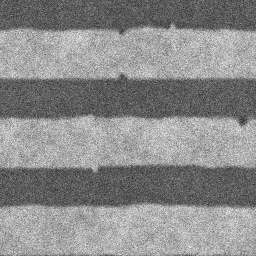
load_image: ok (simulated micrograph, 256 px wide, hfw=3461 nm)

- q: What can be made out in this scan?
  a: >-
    one or a few lines or trenches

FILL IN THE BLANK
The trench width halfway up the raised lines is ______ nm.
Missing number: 530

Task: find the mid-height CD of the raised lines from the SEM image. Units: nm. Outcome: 664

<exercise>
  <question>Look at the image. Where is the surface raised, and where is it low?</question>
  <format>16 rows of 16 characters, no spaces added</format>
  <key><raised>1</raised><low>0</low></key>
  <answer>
0000000000000000
0000000000000000
1111111111111111
1111111111111111
1111111111111111
0000000000000000
0000000000000000
1111111111111110
1111111111111111
1111111111111111
0000010000000000
0000000000000000
0000000000000000
1111111111111111
1111111111111111
1111111111111111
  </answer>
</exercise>